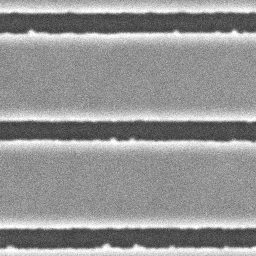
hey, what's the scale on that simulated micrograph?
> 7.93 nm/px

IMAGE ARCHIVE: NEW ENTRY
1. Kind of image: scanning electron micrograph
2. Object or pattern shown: lines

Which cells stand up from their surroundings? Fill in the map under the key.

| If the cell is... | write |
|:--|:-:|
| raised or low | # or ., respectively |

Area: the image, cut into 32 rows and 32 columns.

################################
###########################.###.
................................
................................
################################
################################
################################
################################
################################
################################
################################
################################
################################
################################
################################
................................
................................
................................
################################
################################
################################
################################
################################
################################
################################
################################
################################
################################
#########..##.####....###...###.
................................
................................
################################